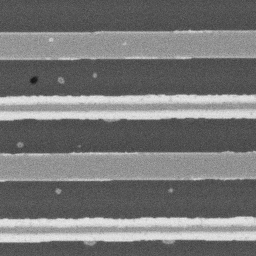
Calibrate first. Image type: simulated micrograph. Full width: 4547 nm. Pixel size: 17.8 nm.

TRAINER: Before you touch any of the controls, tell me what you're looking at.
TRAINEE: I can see lines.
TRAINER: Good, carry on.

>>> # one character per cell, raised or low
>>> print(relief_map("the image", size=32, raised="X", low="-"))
--------------------------------
--------------------------------
--------------------------------
--------------------------------
XXXXXXXXXXXXXXXXXXXXXXXXXXXXXXXX
XXXXXXXXXXXXXXXXXXXXXXXXXXXXXXXX
XXXXXXXXXXXXXXXXXXXXXXXXXXXXXXXX
--------------------------------
--------------------------------
--------------------------------
--------------------------------
--------------------------------
XXXXXXXXXXXXXXXXXXXXXXXXXXXXXXXX
XXXXXXXXXXXXXXXXXXXXXXXXXXXXXXXX
XXXXXXXXXXXXXXXXXXXXX-----------
--------------------------------
--------------------------------
--------------------------------
--------------------------------
XXXXXXXXXXXXXXXXXXXXXXXXXXXXXXXX
XXXXXXXXXXXXXXXXXXXXXXXXXXXXXXXX
XXXXXXXXXXXXXXXXXXXXXXXXXXXXXXXX
XXXXXXXXXXXXXX------------------
--------------------------------
--------------------------------
--------------------------------
--------------------------------
-----------------------------XXX
XXXXXXXXXXXXXXXXXXXXXXXXXXXXXXXX
XXXXXXXXXXXXXXXXXXXXXXXXXXXXXXXX
--------------------------------
--------------------------------